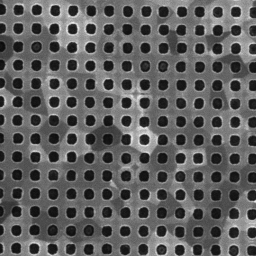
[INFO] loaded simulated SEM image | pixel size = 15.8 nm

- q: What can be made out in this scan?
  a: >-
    a regular array of holes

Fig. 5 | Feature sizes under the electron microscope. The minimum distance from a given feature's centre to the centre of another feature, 283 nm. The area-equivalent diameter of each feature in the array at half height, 179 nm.